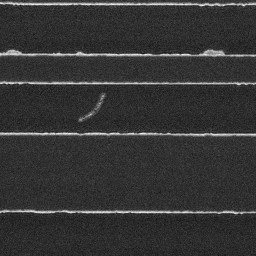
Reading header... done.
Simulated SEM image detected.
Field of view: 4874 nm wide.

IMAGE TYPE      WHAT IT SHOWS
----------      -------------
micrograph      lines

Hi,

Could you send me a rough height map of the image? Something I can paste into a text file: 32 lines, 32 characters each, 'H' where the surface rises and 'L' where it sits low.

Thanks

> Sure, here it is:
LLLLHHHHHLHHHHHHHHHHHHHHHHHHHHHH
LLLLLLLLLLLLLLLLLLLLLLLLLLLLLLLL
LLLLLLLLLLLLLLLLLLLLLLLLLLLLLLLL
LLLLLLLLLLLLLLLLLLLLLLLLLLLLLLLL
LLLLLLLLLLLLLLLLLLLLLLLLLLLLLLLL
LLLLLLLLLLLLLLLLLLLLLLLLLLLLLLLL
LLLLLLLLLLLLLLLLLLLLLLLLLLLLLLLL
HHHHHHHHHHHHHHHHHHHHHHHHHHHHHHHH
HHHHHHHHHHHHHHHHHHHHHHHHHHHHHHHH
HHHHHHHHHHHHHHHHHHHHHHHHHHHHHHHH
LLLLLLLLLLLLLLLLLLLLLLLLLLLLLLLL
LLLLLLLLLLLLLLLLLLLLLLLLLLLLLLLL
LLLLLLLLLLLLLLLLLLLLLLLLLLLLLLLL
LLLLLLLLLLLLLLLLLLLLLLLLLLLLLLLL
LLLLLLLLLLLLLLLLLLLLLLLLLLLLLLLL
LLLLLLLLLLLLLLLLLLLLLLLLLLLLLLLL
LLLLLLLLLLLLLLLLLLLLLLLLLLLLLLLL
HHHHHHHHHHHHHHHHHHHHHHHHHHHHHHHH
HHHHHHHHHHHHHHHHHHHHHHHHHHHHHHHH
HHHHHHHHHHHHHHHHHHHHHHHHHHHHHHHH
HHHHHHHHHHHHHHHHHHHHHHHHHHHHHHHH
HHHHHHHHHHHHHHHHHHHHHHHHHHHHHHHH
HHHHHHHHHHHHHHHHHHHHHHHHHHHHHHHH
HHHHHHHHHHHHHHHHHHHHHHHHHHHHHHHH
HHHHHHHHHHHHHHHHHHHHHHHHHHHHHHHH
HHHHHHHHHHHHHHHHHHHHHHHHHHHHHHHH
LLLLHHLLHLHHHHHHHHHHHHHHHHHHHHHH
LLLLLLLLLLLLLLLLLLLLLLLLLLLLLLLL
LLLLLLLLLLLLLLLLLLLLLLLLLLLLLLLL
LLLLLLLLLLLLLLLLLLLLLLLLLLLLLLLL
LLLLLLLLLLLLLLLLLLLLLLLLLLLLLLLL
LLLLLLLLLLLLLLLLLLLLLLLLLLLLLLLL